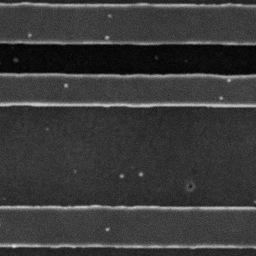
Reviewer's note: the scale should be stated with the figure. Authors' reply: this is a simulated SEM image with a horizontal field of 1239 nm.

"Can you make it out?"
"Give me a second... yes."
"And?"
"lines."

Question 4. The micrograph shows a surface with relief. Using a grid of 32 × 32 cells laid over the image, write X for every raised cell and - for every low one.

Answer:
XXXXXX-----------XX-------------
XXXXXXXXXXXXXXXXXXXXXXXXXXXXXXXX
XXXXXXXXXXXXXXXXXXXXXXXXXXXXXXXX
XXXXXXXXXXXXXXXXXXXXXXXXXXXXXXXX
XXXXXXXXXXXXXXXXXXXXXXXXXXXXXXXX
-----------------XXX-------XXXXX
--------------------------------
--------------------------------
--------------------------------
XXXXXXXXXXXXXXXXXXXXXXXXXXXX-XXX
XXXXXXXXXXXXXXXXXXXXXXXXXXXXXXXX
XXXXXXXXXXXXXXXXXXXXXXXXXXXXXXXX
XXXXXXXXXXXXXXXXXXXXXXXXXXXXXXXX
--------------------------------
--------------------------------
--------------------------------
--------------------------------
--------------------------------
--------------------------------
--------------------------------
--------------------------------
--------------------------------
--------------------------------
--------------------------------
--------------------------------
--------------------------------
XXXXXXXXXXXXXXXXXXXXXXXXXXXXXXXX
XXXXXXXXXXXXXXXXXXXXXXXXXXXXXXXX
XXXXXXXXXXXXXXXXXXXXXXXXXXXXXXXX
XXXXXXXXXXXXXXXXXXXXXXXXXXXXXXXX
XXXXXXXXXXXXXXXXXXXXXXXXXXXXXXXX
--------------------------------